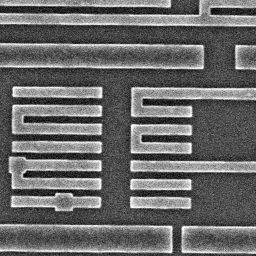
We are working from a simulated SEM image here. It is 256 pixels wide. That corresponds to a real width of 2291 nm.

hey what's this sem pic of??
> wiring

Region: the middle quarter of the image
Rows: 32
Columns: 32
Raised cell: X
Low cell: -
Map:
XXXXXXXXXXXXXXXXXXXXXXXXXXXXXXXX
--------------------------------
--------------------------------
--------------------------------
--------------------------------
--------------------------------
XXXXXXXXX--------XXXXXXXXXXXXXXX
XXXXXXXXX--------XXXXXXXXXXXXXXX
-----------------XXX-XXXXXXXXXXX
-----------------XX-------------
XXXXXXXXX--------XXX------------
XXXXXXXXX--------XXXXXXXXXXXXXXX
XXXXXXXXX--------XXXXXXXXXXXXXXX
--------------------------------
--------------------------------
XXXXXXXXX--------XXXXXXXXXXXXXXX
XXXXXXXXX--------XXXXXXXXXXXXXXX
-----XXXX--------XXXXXXXXXXXXXXX
-----------------XX-------------
-----------------XX-------------
XXXXXXXXX--------XXXXXXXXXXXXXXX
XXXXXXXXX--------XXXXXXXXXXXXXXX
--------------------------------
--------------------------------
XXXXXXXXX--------XXXXXXXXXX-----
XXXXXXXXX--------XXXXXXXXXXXXXXX
XXXXXXXXX--------XXXXXXXXXXXXXXX
--------------------------------
--------------------------------
XXXXXXXXX--------XXXXXXXXXXXXXXX
XXXXXXXXX--------XXXXXXXXXXXXXXX
--------------------------------